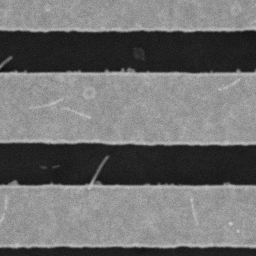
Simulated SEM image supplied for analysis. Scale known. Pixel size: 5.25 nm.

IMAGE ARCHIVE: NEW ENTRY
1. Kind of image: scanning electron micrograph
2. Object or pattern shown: lines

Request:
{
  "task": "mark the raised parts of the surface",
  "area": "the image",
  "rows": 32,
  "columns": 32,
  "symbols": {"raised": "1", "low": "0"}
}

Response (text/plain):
11111111111111111111111111111111
11111111111111111111111111111111
11111111111111111111111111111111
11111111111111111111111111111111
00000000000000000000000000000000
00000000000000000000000000000000
00000000000000000000000000000000
00000000000000000000000000000000
00000000000000000000000000000000
11111111111111111111111111111111
11111111111111111111111111111111
11111111111111111111111111111111
11111111111111111111111111111111
11111111111111111111111111111111
11111111111111111111111111111111
11111111111111111111111111111111
11111111111111111111111111111111
11111111111111111111111111111111
00000000000000000000000000000000
00000000000000000000000000000000
00000000000000000000000000000000
00000000000000000000000000000000
00000000000000000000000000000000
11111111111111111111111111111111
11111111111111111111111111111111
11111111111111111111111111111111
11111111111111111111111111111111
11111111111111111111111111111111
11111111111111111111111111111111
11111111111111111111111111111111
11111111111111111111111111111111
00000000000000000000000000000000